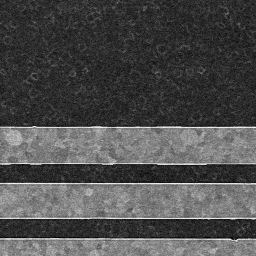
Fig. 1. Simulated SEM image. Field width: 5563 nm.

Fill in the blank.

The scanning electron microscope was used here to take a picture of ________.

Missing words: parallel lines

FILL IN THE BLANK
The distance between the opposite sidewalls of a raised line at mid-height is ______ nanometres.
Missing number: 786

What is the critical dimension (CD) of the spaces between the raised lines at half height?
429 nanometres